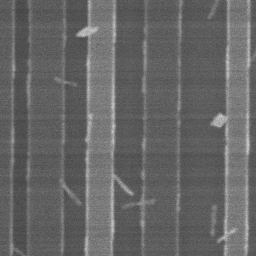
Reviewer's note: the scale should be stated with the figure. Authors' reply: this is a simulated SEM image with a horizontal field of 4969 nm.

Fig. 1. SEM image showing lines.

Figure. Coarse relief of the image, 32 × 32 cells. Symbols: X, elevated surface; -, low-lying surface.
XX--XXXX---XXX----XXXXX------XX-
XX--XXXX---XXX----XXXXX------XX-
XX--XXXX---XXX----XXXXX------XX-
XX--XXXX---XXX----XXXXX------XX-
XX--XXXX---XXX----XXXXX------XX-
XX--XXXX---XXX----XXXX-------XX-
XX--XXXX---XXX----XXXX------XXX-
XX--XXXX---XXX----XXXX------XXX-
XX--XXXX---XXX----XXXX------XXX-
XX--XXXX---XXX----XXXX------XXX-
XX--XXXX---XXX----XXXX------XXX-
XX--XXXX---XXX----XXXX------XXX-
XX--XXXX---XXX----XXXX------XXX-
XX--XXXX---XXX----XXXX------XXX-
XX--XXXX---XXX----XXXX------XXX-
XX--XXXX---XXX----XXXX------XXX-
XX--XXXX---XXX----XXXX------XXX-
XX--XXXX---XXX----XXXX------XXX-
XX--XXXX---XXX----XXXX------XXX-
XX--XXXX---XXX----XXXX------XXX-
XX--XXXX---XXX----XXXX------XXX-
X---XXXX---XXX----XXXX------XXX-
X---XXXX---XXX----XXXX------XXX-
X---XXXX---XXX----XXXX------XXX-
X---XXXX---XXX----XXXX------XXX-
X---XXXX---XXX----XXXX------XXX-
X---XXXX---XXX----XXXX------XXX-
X---XXXX---XXX----XXXX------XXX-
X---XXXX---XXX----XXXX------XXX-
X---XXXX---XXX----XXXX------XXX-
X---XXXX---XXX----XXXX------XXX-
X---XXXX---XXX----XXXX------XXX-